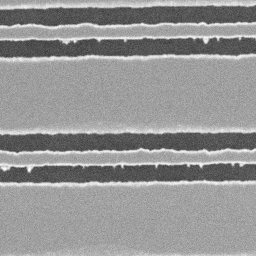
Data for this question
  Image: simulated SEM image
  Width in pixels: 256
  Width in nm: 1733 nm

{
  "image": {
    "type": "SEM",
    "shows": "lines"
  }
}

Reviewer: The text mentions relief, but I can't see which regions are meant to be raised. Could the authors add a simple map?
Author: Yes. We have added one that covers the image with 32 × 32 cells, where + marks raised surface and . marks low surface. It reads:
+++++++++++++++++++++++++..+++++
................................
................................
++++++++++++++++++++++++++++++++
++++++++++++++++++++++++++++++++
................................
................................
++++++++++++++++++++++++++++++++
++++++++++++++++++++++++++++++++
++++++++++++++++++++++++++++++++
++++++++++++++++++++++++++++++++
++++++++++++++++++++++++++++++++
++++++++++++++++++++++++++++++++
++++++++++++++++++++++++++++++++
++++++++++++++++++++++++++++++++
++++++++++++++++++++++++++++++++
+++++.+.........................
................................
................................
++++++++++++++++++++++++++++++++
++++++++++++++++++++++++++......
................................
................................
++++++++++++++++++++++++++++++++
++++++++++++++++++++++++++++++++
++++++++++++++++++++++++++++++++
++++++++++++++++++++++++++++++++
++++++++++++++++++++++++++++++++
++++++++++++++++++++++++++++++++
++++++++++++++++++++++++++++++++
++++++++++++++++++++++++++++++++
++++++++++++++++++++++++++++++++